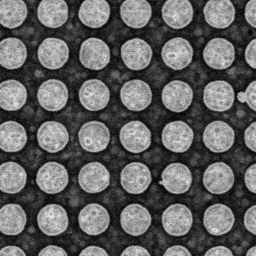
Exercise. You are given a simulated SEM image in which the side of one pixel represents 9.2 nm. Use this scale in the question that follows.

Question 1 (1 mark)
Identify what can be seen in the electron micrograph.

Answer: a regular array of raised bodies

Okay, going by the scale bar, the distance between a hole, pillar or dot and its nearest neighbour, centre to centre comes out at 0.379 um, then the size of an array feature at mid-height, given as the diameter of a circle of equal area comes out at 279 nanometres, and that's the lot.